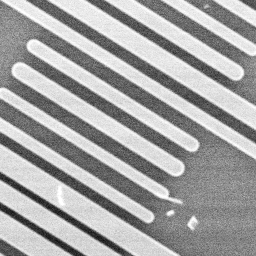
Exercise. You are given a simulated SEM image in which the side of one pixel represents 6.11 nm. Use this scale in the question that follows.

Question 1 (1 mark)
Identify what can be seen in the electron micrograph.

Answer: groups of lines, slits or small figures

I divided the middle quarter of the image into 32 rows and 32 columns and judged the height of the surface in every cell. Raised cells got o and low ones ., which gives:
ooo........ooooo.......oooooooo.
ooooo........ooooo......oooooooo
.oooooo.......ooooo.......oooooo
..oooooo........ooooo......ooooo
....oooooo........ooooo......ooo
......ooooo........ooooo.......o
.......oooooo........ooooo......
oo.......ooooo........ooooo.....
ooo.......oooooo........ooooo...
ooooo.......oooooo........ooooo.
ooooooo.......ooooo........ooooo
.ooooooo.......oooooo........ooo
...ooooooo.......oooooo.......oo
....ooooooo.......oooooo........
......ooooooo.......oooooo......
........ooooooo.......ooooo.....
oo.......ooooooo.......oooooo...
ooo........ooooooo.......ooooo..
ooooo.......ooooooo.......oooooo
..ooooo.......ooooooo.......oooo
....oooo........ooooooo.......oo
.....ooooo.......ooooooo.......o
.......oooo........ooooooo......
.........oooo........ooooooo....
o.........oooo........ooooooo...
ooo.........oooo........oooooo..
oooo.........ooooo.......ooooo..
..oooo.........oooo........oo...
...ooooo.........oooo...........
.....oooo.........oooo..........
......ooooo.........oooo........
oo......ooooo........ooooo......